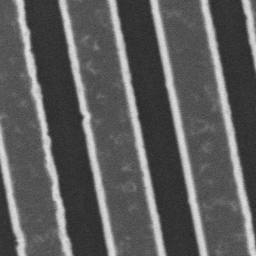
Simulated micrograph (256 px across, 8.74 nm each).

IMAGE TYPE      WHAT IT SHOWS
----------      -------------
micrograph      one or a few lines or trenches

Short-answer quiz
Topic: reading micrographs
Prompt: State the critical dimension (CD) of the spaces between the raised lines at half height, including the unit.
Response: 366 nm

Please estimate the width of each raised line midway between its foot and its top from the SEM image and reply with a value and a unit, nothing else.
420 nm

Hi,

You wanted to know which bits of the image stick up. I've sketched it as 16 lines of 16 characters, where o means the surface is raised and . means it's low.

o...ooo...ooo..o
o...ooo...ooo...
oo..ooo...ooo...
oo...ooo..ooo...
oo...ooo...ooo..
oo...ooo...ooo..
oo...ooo...ooo..
ooo..ooo...ooo..
ooo...ooo..ooo..
ooo...ooo...ooo.
ooo...ooo...ooo.
.oo...ooo...ooo.
.ooo..ooo...ooo.
.ooo...ooo..ooo.
.ooo...ooo..oooo
.ooo...ooo...ooo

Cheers